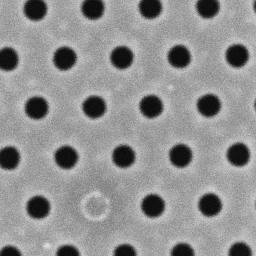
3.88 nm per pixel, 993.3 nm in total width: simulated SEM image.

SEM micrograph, a regular array of holes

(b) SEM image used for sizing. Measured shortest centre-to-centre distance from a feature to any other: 0.221 microns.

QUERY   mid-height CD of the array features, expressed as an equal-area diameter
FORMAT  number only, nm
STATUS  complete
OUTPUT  95.8